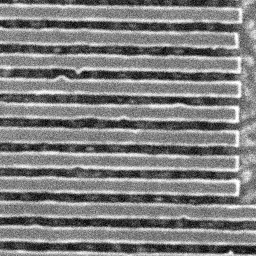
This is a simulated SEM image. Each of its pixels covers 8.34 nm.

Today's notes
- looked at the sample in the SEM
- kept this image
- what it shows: parallel lines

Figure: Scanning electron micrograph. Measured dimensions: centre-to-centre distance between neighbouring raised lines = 24.7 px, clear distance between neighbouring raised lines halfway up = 87.6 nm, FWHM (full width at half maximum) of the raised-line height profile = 14.4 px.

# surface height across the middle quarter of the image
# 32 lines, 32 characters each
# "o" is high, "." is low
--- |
oooooooooooooooooooooooooooooooo
...oo.......o.........oooooooooo
................................
................................
ooooooooooooooooooooooooooooooo.
oooooooooooooooooooooooooooooooo
oooooooooooooooooooooooooooooooo
..........oooooooooooooooooooooo
................................
................................
ooooooo..o.oooooooooooooooooooo.
oooooooooooooooooooooooooooooooo
oooooooooooooooooooooooooooooooo
ooo.......oooooooooooooooooooooo
................................
................................
ooooooooooooooooo...............
oooooooooooooooooooooooooooooooo
oooooooooooooooooooooooooooooooo
oooooooooooooooooooooooooooooooo
................................
................................
oooo.........o.o................
oooooooooooooooooooooooooooooooo
oooooooooooooooooooooooooooooooo
oooooooooooooooooooooooooooooooo
................................
................................
................................
oooooooooooooooooooooooooooooooo
oooooooooooooooooooooooooooooooo
oooooooooooooooooooooooooooooooo